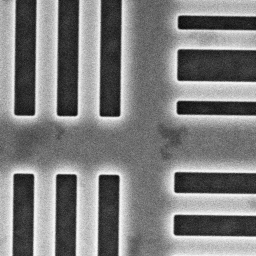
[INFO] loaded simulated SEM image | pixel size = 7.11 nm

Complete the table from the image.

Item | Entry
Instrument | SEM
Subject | groups of lines, slits or small figures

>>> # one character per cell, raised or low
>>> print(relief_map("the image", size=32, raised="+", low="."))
++...++...+++..+++++++++++++++++
++...++...++...+++++++++++++++++
++...++...++...+++++++..........
++...++...++...+++++++..........
++...++...++...+++++++++++++++++
++...++...++...+++++++++++++++++
++...++...++...+++++++..........
++...++...++...+++++++..........
++...++...++...+++++++..........
++...++...++...+++++++..........
++..+++...++...+++++++++++++++++
++..+++...++...+++++++++++++++++
++..+++...++...++++++++..+++++++
++..+++...++...+++++++..........
++..+++..++++..++++++++++++.....
++++++++++++++++++++++++++++++++
++++++++++++++++++++++++++++++++
++++++++++++++++++++++++++++++++
++++++++++++++++++++++++++++++++
++++++++++++++++++++++++++++++++
++++++++++++++++++++++++++++++++
++++++++++++++++++++++..........
++..+++...++...+++++++..........
++..+++...++...+++++++..........
++..+++...++...+++++++++++++++++
++..+++...++...+++++++++++++++++
++..+++...++...+++++++++++++++++
++..+++...++...+++++++..........
++..+++...++...+++++++..........
++..+++...++...+++++++..........
++..+++...++...+++++++++++++++++
++..+++...++...+++++++++++++++++